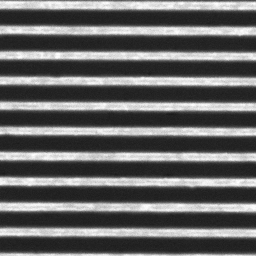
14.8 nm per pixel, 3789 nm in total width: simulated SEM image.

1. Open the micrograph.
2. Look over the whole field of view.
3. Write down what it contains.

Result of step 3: parallel lines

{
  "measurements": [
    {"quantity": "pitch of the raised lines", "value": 373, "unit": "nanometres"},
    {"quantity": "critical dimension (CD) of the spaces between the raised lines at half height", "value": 224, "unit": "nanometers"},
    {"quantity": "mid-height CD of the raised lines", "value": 141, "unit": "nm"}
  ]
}